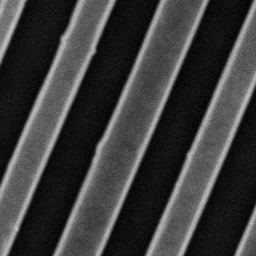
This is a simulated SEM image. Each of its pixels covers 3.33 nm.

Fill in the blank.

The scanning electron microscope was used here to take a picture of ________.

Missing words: one or a few lines or trenches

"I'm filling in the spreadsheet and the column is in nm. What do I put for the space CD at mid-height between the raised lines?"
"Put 150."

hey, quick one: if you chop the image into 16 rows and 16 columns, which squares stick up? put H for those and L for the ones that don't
HLLLLHHLLLHHHLLL
HLLLHHLLLLHHLLLH
LLLLHHLLLHHHLLLH
LLLLHHLLLHHLLLLH
LLLHHLLLHHHLLLHH
LLLHHLLLHHHLLLHH
LLHHLLLHHHLLLHHL
LLHHLLLHHHLLLHHL
LHHHLLLHHLLLHHHL
LHHLLLHHHLLLHHLL
LHHLLLHHHLLLHHLL
HHLLLHHHLLLHHLLL
HHLLLHHHLLLHHLLL
HLLLHHHLLLHHLLLL
HLLLHHHLLLHHLLLH
HLLLHHLLLHHHLLLH